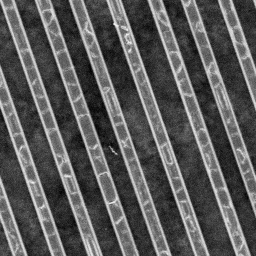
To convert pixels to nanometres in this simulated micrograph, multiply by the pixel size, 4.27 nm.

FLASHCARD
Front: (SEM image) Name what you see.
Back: parallel lines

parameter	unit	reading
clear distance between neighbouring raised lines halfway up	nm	92.4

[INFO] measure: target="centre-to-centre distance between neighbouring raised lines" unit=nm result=147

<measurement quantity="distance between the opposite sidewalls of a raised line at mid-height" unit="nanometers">54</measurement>